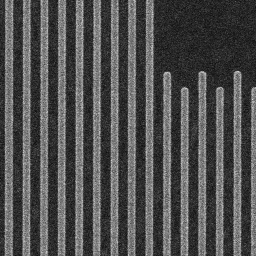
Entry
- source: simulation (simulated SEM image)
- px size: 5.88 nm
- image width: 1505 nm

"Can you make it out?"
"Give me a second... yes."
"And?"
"parallel lines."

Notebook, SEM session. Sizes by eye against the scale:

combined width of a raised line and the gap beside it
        103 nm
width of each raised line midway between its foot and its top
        39.7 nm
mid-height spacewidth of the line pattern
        63.9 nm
